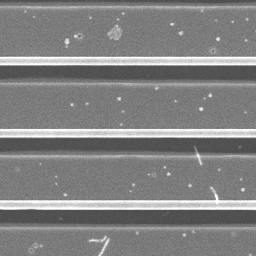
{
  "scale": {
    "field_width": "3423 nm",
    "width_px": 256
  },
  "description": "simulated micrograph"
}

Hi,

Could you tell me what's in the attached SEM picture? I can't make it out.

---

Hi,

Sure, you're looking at lines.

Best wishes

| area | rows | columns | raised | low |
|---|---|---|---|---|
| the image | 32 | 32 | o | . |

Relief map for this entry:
................................
oooooooooooooooooooooooooooooooo
oooooooooooooooooooooooooooooooo
oooooooooooooooooooooooooooooooo
oooooooooooooooooooooooooooooooo
oooooooooooooooooooooooooooooooo
oooooooooooooooooooooooooooooooo
oooooooooooooooooooooooooooooooo
................................
................................
ooooooooooooooooooooooooooooooo.
oooooooooooooooooooooooooooooooo
oooooooooooooooooooooooooooooooo
oooooooooooooooooooooooooooooooo
oooooooooooooooooooooooooooooooo
oooooooooooooooooooooooooooooooo
oooooooooooooooooooooooooooooooo
................................
................................
oooooooooooooooooooooooooooooooo
oooooooooooooooooooooooooooooooo
oooooooooooooooooooooooooooooooo
oooooooooooooooooooooooooooooooo
oooooooooooooooooooooooooooooooo
oooooooooooooooooooooooooooooooo
oooooooooooooooooooooooooooooooo
................................
................................
oooooooooooooooooooooooooooooooo
oooooooooooooooooooooooooooooooo
oooooooooooooooooooooooooooooooo
oooooooooooooooooooooooooooooooo